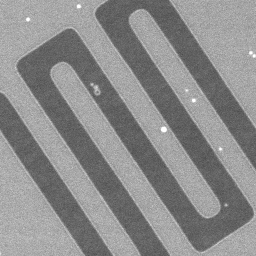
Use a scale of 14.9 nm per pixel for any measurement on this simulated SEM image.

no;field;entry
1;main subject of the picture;groups of lines, slits or small figures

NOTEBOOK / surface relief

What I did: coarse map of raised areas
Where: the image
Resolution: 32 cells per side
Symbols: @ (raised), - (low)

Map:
-------------@@@@@@@@@----------
------------@@@@@-@@@@----------
------------@@@@---@@@@---------
-------------@@@@---@@@@--------
-------@@@---@@@@---@@@@--------
-----@@@@@@---@@@@---@@@@-------
----@@@@@@@----@@@----@@@@------
--@@@@@@@@@@---@@@@----@@@------
--@@@@@--@@@@---@@@@---@@@@-----
--@@@@----@@@----@@@@---@@@@----
---@@@@---@@@@---@@@@----@@@----
----@@@@---@@@@---@@@@---@@@@---
@---@@@@----@@@----@@@@---@@@@--
@@---@@@@---@@@@---@@@@----@@@--
@@@---@@@@---@@@@---@@@@---@@@@-
@@@----@@@----@@@----@@@@---@@@@
@@@@---@@@@---@@@@---@@@@----@@@
-@@@@---@@@@---@@@@---@@@@---@@@
-@@@@----@@@----@@@----@@@@---@@
--@@@@---@@@@---@@@@---@@@@----@
---@@@@---@@@@---@@@@---@@@@---@
---@@@@----@@@----@@@@---@@@@---
----@@@@---@@@@---@@@@---@@@@---
-----@@@@---@@@@---@@@@---@@@@--
-----@@@@----@@@----@@@@---@@@@-
------@@@@---@@@@---@@@@---@@@@-
-------@@@@---@@@@---@@@@--@@@@@
-------@@@@----@@@----@@@@@@@@@@
--------@@@@---@@@@---@@@@@@@@--
---------@@@@---@@@@---@@@@@@---
---------@@@@----@@@----@@@-----
----------@@@@---@@@@-----------